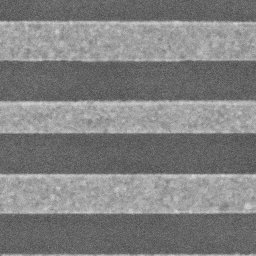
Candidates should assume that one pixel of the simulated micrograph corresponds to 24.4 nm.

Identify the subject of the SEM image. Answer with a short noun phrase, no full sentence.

lines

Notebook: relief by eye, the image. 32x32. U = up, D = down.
DDDDDDDDDDDDDDDDDDDDDDDDDDDDDDDD
DDDDDDDDDDDDDDDDDDDDDDDDDDDDDDDD
DDDDDDDDDDDDDDDDDDDDDDDDDDDDDDDD
UUUUUUUUUUUUUUUUUUUUUUUUUUUUUUUU
UUUUUUUUUUUUUUUUUUUUUUUUUUUUUUUU
UUUUUUUUUUUUUUUUUUUUUUUUUUUUUUUU
UUUUUUUUUUUUUUUUUUUUUUUUUUUUUUUU
DDUUUDDDUDUUUUUUUUUUUUUDDDDDDDDD
DDDDDDDDDDDDDDDDDDDDDDDDDDDDDDDD
DDDDDDDDDDDDDDDDDDDDDDDDDDDDDDDD
DDDDDDDDDDDDDDDDDDDDDDDDDDDDDDDD
DDDDDDDDDDDDDDDDDDDDDDDDDDDDDDDD
DDDDDDDDDDDDDDDDDDDDDDDDDDDDDDDD
UUUUUUUUUUUUUUUUUUUUUUUUUUUUUUUU
UUUUUUUUUUUUUUUUUUUUUUUUUUUUUUUU
UUUUUUUUUUUUUUUUUUUUUUUUUUUUUUUU
UUUUUUUUUUUUUUUUUUUUUUUUUUUUUUUU
DDDDDDDDDDDDDDDDDDDDDDDDDDDDDDDD
DDDDDDDDDDDDDDDDDDDDDDDDDDDDDDDD
DDDDDDDDDDDDDDDDDDDDDDDDDDDDDDDD
DDDDDDDDDDDDDDDDDDDDDDDDDDDDDDDD
DDDDDDDDDDDDDDDDDDDDDDDDDDDDDDDD
UUUUUUUUUUUUUUUUUUUUUUUUUUUUUUUU
UUUUUUUUUUUUUUUUUUUUUUUUUUUUUUUU
UUUUUUUUUUUUUUUUUUUUUUUUUUUUUUUU
UUUUUUUUUUUUUUUUUUUUUUUUUUUUUUUU
UUUUUUUUUUUUUUUUUUUUUUUUUUUUUUUU
DDDDDDDDDDDDDDDDDDDDDDDDDDDDDDDD
DDDDDDDDDDDDDDDDDDDDDDDDDDDDDDDD
DDDDDDDDDDDDDDDDDDDDDDDDDDDDDDDD
DDDDDDDDDDDDDDDDDDDDDDDDDDDDDDDD
DDDDDDDDDDDDDDDDDDDDDDDDDDDDDDDD